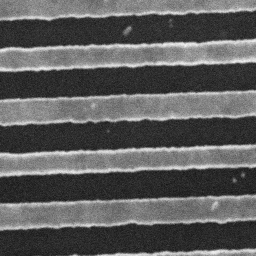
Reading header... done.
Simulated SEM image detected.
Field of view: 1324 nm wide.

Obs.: lines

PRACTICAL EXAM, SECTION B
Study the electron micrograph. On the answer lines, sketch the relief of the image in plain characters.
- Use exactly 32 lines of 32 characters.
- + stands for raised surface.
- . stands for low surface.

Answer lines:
++++++++++++++++++++++++++++++++
+++++++++++++++++++++++++.......
................................
................................
................................
....................++++++++++++
++++++++++++++++++++++++++++++++
++++++++++++++++++++++++++++++++
+++++++++.......................
................................
................................
...............................+
++++++++++++++++++++++++++++++++
++++++++++++++++++++++++++++++++
+++++++++++++++++++++++++++++++.
+++.............................
................................
................................
.......................+++++++++
++++++++++++++++++++++++++++++++
++++++++++++++++++++++++++++++++
+++++++++++++...................
................................
................................
..............................++
...+++++++++++++++++++++++++++++
++++++++++++++++++++++++++++++++
++++++++++++++++++++++++++++++++
++++............................
................................
................................
........................++++++++